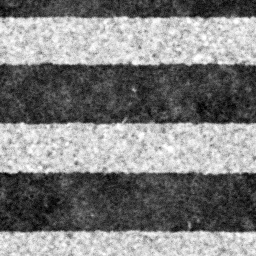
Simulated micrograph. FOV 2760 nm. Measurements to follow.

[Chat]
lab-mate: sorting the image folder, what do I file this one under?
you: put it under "one or a few lines or trenches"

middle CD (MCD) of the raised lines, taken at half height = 509 nanometres